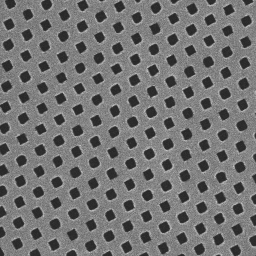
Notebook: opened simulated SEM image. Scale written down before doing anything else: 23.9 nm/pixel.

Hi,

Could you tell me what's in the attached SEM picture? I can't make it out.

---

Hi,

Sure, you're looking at a regular array of holes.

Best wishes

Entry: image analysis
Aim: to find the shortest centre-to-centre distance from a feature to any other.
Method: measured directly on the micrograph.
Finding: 495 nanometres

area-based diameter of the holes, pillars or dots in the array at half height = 0.253 microns